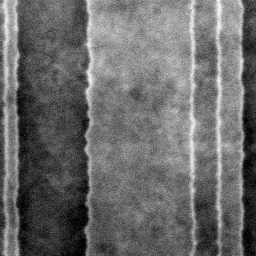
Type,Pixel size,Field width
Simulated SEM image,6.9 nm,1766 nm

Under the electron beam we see lines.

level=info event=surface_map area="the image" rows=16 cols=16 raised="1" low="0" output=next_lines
1000001111111110
1000001111111110
1000001111111110
1000001111111110
1000001111111110
1000001111111110
1000001111111110
1000001111111110
1000011111111110
1000011111111110
1000001111111110
1000001111111110
1000011111111110
1000001111111110
1000011111111110
1000011111111110